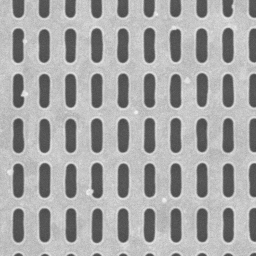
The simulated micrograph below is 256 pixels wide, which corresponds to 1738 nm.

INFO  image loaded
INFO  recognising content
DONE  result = groups of lines, slits or small figures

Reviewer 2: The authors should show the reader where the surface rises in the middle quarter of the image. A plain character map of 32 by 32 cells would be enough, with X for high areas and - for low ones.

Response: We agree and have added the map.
XXXXXXXXXXXXXXXXXXXXXXXXXXXXXXXX
XXXXXXXXXXXXXXXXXXXXXXXXXXXXXXXX
X-XXXXX--XXXXX--XXXX--XXXXX--XXX
---XXXX---XXX---XXXX---XXXX--XXX
---XXX----XXX---XXXX---XXX----XX
---XXX----XXX---XXXX---XXX----XX
---XXX----XXX---XXXX---XXX----XX
---XXXX---XXX---XXXX---XXX----XX
---XXXX---XXX---XXXX---XXX----XX
---XXXX---XXX---XXXX---XXX----XX
---XXXX--XXXX---XXXX---XXXX--XXX
XXXXXXXXXXXXXXXXXXXXXXXXXXXXXXXX
XXXXXXXXXXXXXXXXXXXXXXXXXXXXXXXX
X-XXXXXX-XXXXX-XXXXXX-XXXXX--XXX
---XXXX---XXX---XXXX---XXX---XXX
---XXX----XXX---XXXX---XXX----XX
---XXX----XXX----XXX---XXX----XX
---XXX----XXX----XXX---XXX---XXX
---XXXX---XXX----XXX---XXX----XX
---XXXX---XXX---XXXX---XXX----XX
---XXXX---XXX---XXXX---XXX----XX
---XXXX---XXXX--XXXX---XXXX--XXX
XXXXXXXXXXXXXXXXXXXXXXXXXXXXXXXX
XXXXXXXXXXXXXXXXXXXXXXXXXXXXXXXX
XXXXXXXXXXXXXXXXXXXXXXXXXXXXXXXX
X--XXXX---XXXX--XXXX---XXXX--XXX
---XXXX---XXX---XXXX---XXX----XX
---XXXX---XXX----XXX---XXX----XX
---XXXX---XXX----XXX---XXX----XX
---XXXX---XXX----XXX---XXX----XX
---XXXX---XXX----XXX---XXX----XX
---XXXX---XXX---XXXX---XXX----XX